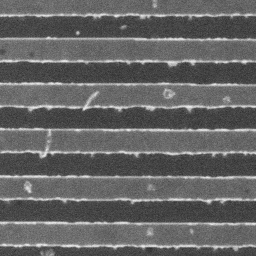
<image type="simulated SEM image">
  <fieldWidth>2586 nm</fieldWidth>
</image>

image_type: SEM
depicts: lines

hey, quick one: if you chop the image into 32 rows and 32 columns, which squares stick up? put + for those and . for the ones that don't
++++++++++++++++++++++++++++++++
++++++++++++++++++++++++++++++++
................................
................................
................................
++++++++++++++++++++++++++++++++
++++++++++++++++++++++++++++++++
++++++++++++++++++++++++++++++++
................................
................................
++++++++............++..........
++++++++++++++++++++++++++++++++
++++++++++++++++++++++++++++++++
..........+.....................
................................
................................
++++++++++++++++++++++++++++++++
++++++++++++++++++++++++++++++++
++++++++++++++++++++++++++++++++
................................
................................
................................
++++++++++++++++++++++++++++++++
++++++++++++++++++++++++++++++++
++++++++++++++++++++++++++++++++
................................
................................
................................
++++++++++++++++++++++++++++++++
++++++++++++++++++++++++++++++++
++++++++++++++++++++++++++++++++
................................